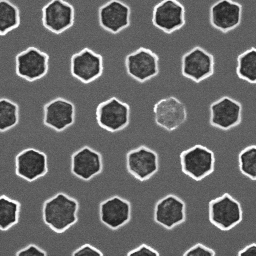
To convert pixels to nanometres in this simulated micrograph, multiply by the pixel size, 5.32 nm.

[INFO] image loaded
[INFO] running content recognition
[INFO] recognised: a regular array of holes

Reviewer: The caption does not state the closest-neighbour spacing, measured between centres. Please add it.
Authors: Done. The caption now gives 293 nm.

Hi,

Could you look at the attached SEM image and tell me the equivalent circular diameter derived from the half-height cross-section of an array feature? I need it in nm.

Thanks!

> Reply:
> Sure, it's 151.